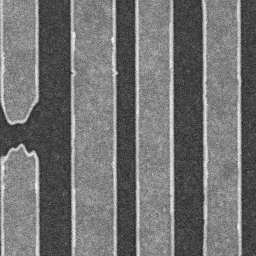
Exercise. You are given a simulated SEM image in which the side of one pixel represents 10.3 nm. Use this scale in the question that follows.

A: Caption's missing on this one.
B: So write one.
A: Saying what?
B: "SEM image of one or a few lines or trenches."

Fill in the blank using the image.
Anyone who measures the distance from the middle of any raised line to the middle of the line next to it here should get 692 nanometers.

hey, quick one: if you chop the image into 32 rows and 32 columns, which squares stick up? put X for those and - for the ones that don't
XXXXX----XXXXX---XXXX-----XXXX--
XXXXX----XXXXX---XXXX-----XXXX--
XXXXX----XXXXX---XXXX-----XXXX--
XXXXX----XXXXX---XXXX-----XXXX--
XXXXX----XXXXX---XXXX-----XXXX--
XXXXX----XXXXX---XXXX-----XXXX--
XXXXX----XXXXX---XXXX-----XXXX--
XXXXX----XXXXX---XXXX-----XXXX--
XXXXX----XXXXX---XXXX-----XXXX--
XXXXX----XXXXX---XXXX-----XXXX--
XXXXX----XXXXX---XXXX-----XXXX--
XXXXX----XXXXX---XXXX-----XXXX--
XXXXX----XXXXX---XXXX-----XXXX--
XXXX-----XXXXX---XXXX-----XXXX--
-XX------XXXXX---XXXX-----XXXX--
---------XXXXX---XXXX-----XXXX--
---------XXXXX---XXXX-----XXXX--
---------XXXXX---XXXX-----XXXX--
--X------XXXXX---XXXX-----XXXX--
-XXX-----XXXXX---XXXX-----XXXX--
XXXXX----XXXXX---XXXX-----XXXX--
XXXXX----XXXXX---XXXX-----XXXX--
XXXXX----XXXXX---XXXX-----XXXX--
XXXXX----XXXXX---XXXX-----XXXX--
XXXXX----XXXXX---XXXX-----XXXX--
XXXXX----XXXXX---XXXX-----XXXX--
XXXXX----XXXXX---XXXX-----XXXX--
XXXXX----XXXXX---XXXXX----XXXX--
XXXXX----XXXXX---XXXXX----XXXX--
XXXXX----XXXXX---XXXXX----XXXX--
XXXXX----XXXXX---XXXXX----XXXX--
XXXXX----XXXXX---XXXXX----XXXX--